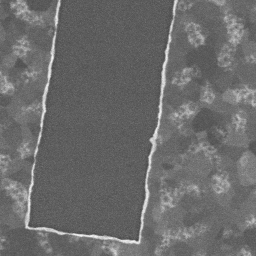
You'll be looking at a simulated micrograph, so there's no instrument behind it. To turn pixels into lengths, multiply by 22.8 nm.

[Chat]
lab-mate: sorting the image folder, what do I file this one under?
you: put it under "one or a few lines or trenches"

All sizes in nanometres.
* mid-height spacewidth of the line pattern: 2590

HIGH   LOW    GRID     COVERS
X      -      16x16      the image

XXXX-------XXXXX
XXXX-------XXXXX
XXX--------XXXXX
XXX-------XXXXXX
XXX-------XXXXXX
XXX-------XXXXXX
XXX-------XXXXXX
XXX-------XXXXXX
XX--------XXXXXX
XX-------XXXXXXX
XX-------XXXXXXX
XX-------XXXXXXX
XX-------XXXXXXX
XX-------XXXXXXX
XXXX-----XXXXXXX
XXXXXXXXXXXXXXXX